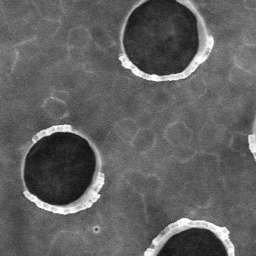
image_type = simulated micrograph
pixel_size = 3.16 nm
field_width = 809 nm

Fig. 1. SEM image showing holes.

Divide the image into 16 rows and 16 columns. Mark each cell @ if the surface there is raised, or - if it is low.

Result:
@@@@@@@@----@@@@
@@@@@@@@-----@@@
@@@@@@@@-----@@@
@@@@@@@@----@@@@
@@@@@@@@@--@@@@@
@@@@@@@@@@@@@@@@
@@@@@@@@@@@@@@@@
@@@@@@@@@@@@@@@@
@@@--@@@@@@@@@@@
@@----@@@@@@@@@@
@-----@@@@@@@@@@
@@----@@@@@@@@@@
@@@--@@@@@@@@@@@
@@@@@@@@@@@@@@@@
@@@@@@@@@@@--@@@
@@@@@@@@@@----@@